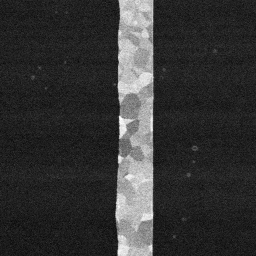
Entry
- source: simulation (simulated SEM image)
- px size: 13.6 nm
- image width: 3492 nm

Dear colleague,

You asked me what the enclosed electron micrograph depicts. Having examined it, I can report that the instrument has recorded one or a few lines or trenches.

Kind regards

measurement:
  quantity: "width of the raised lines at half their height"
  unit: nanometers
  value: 464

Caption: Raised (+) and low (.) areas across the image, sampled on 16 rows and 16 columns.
.......+++......
.......+++......
........++......
.......+++......
.......+++......
.......+++......
.......+++......
.......++.......
.......++.......
.......+++......
.......+++......
.......+++......
.......+++......
.......+++......
.......++.......
.......++.......